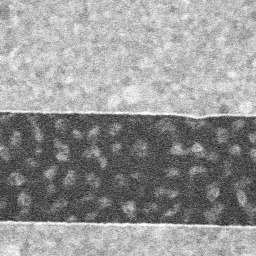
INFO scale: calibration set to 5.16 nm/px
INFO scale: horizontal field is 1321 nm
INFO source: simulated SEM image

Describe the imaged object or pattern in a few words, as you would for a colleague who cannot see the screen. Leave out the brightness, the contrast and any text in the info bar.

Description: one or a few lines or trenches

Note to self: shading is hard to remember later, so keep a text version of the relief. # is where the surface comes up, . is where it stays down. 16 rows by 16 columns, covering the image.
################
################
################
################
################
################
################
................
................
................
................
................
................
................
################
################